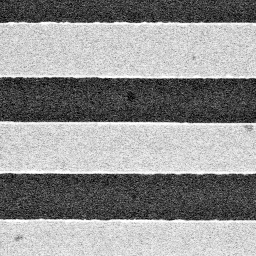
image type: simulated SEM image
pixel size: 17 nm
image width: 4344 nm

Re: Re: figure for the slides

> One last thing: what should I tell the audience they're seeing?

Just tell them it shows lines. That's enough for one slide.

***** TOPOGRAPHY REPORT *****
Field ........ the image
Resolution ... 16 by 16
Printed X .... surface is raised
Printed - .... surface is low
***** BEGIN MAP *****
----------------
XXXXXXXXXXXXXXXX
XXXXXXXXXXXXXXXX
XXXXXXXXXXXXXXXX
XXXXXXXXXXXXXXXX
----------------
----------------
----------------
XXXXXXXXXXXXXXXX
XXXXXXXXXXXXXXXX
XXXXXXXXXXXXXXXX
----------------
----------------
----------------
XXXXXXXXXXXXXXXX
XXXXXXXXXXXXXXXX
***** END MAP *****